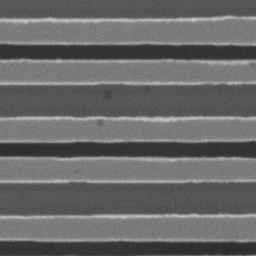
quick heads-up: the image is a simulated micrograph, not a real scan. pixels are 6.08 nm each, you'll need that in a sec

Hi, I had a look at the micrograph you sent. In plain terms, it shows lines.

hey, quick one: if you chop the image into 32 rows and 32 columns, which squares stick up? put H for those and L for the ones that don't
LLLLLLLLLLLLLLLLLLLLLLLLLLLLLLLL
LLLLLLLLLLLLLLLLLLLLLLLLLLLLLLLL
HHHHHHHHHHHHHHHHHHHHHHHHHHHHHHHH
HHHHHHHHHHHHHHHHHHHHHHHHHHHHHHHH
HHHHHHHHHHHHHHHHHHHHHHHHHHHHHHHH
LHHHHHHHHHHHHHHHHHHHHHHHHHHHHHHH
LLLLLLLLLLLLLLLLLLLLLLLLLLLLLLLL
LLHHLLLHLLLLLLLLLLLLLHLLLLLLLLLL
HHHHHHHHHHHHHHHHHHHHHHHHHHHHHHHH
HHHHHHHHHHHHHHHHHHHHHHHHHHHHHHHH
HHHHHHHHHHHHLLLHHHHHHHHHHLLLLLLL
LLLLLLLLLLLLLLLLLLLLLLLLLLLLLLLL
LLLLLLLLLLLLLLLLLLLLLLLLLLLLLLLL
LLLLLLLLLLLLLLLLLLLLLLLLLLLLLLLL
LLLLLLLLLLLLLLLLLLLLLLLLLLLLLLLL
HHHHHHHHHHHHHHHHHHHHHHHHHHHHHHHH
HHHHHHHHHHHHHHHHHHHHHHHHHHHHHHHH
HHHHHHHHHHHHHHHHHHHHHHHHHHHHHHHH
LLLLLLLLLLLLLLLLLLLLLLLLLLLLLLLL
LLLLLLLLLLLLLLLLLLLLLLLLLLLLLLLL
HHHHHHHHHHHHHHHHHHHHHHHHHHHHHHHH
HHHHHHHHHHHHHHHHHHHHHHHHHHHHHHHH
HHHHHHHHHHHHHHHHHHHHHHHHHHHHHHHH
LLLLLLLLLLLLLLLLLLLLLLLLLLLLLLLL
LLLLLLLLLLLLLLLLLLLLLLLLLLLLLLLL
LLLLLLLLLLLLLLLLLLLLLLLLLLLLLLLL
LLLLLLLLLLLLLLLLLLLLLLLLLLLLLLLL
HHHHHHHHHHHHHHHHHHHHHHHHHHHHHHHH
HHHHHHHHHHHHHHHHHHHHHHHHHHHHHHHH
HHHHHHHHHHHHHHHHHHHHHHHHHHHHHHHH
LLLLLLLLLLLLLLLLLLLLLLLLLLLLLLLL
LLLLLLLLLLLLLLLLLLLLLLLLLLLLLLLL